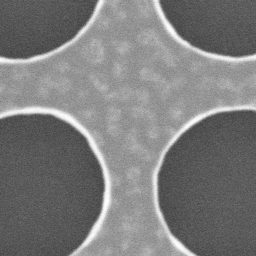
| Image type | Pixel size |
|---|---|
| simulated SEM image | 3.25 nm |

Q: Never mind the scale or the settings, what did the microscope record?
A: holes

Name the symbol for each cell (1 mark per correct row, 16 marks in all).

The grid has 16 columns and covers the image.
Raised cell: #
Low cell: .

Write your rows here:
......####......
.....######.....
....#######.....
..###########...
################
################
################
....########....
.....######.....
......####......
......####......
.......###......
.......###......
......####......
......#####.....
.....######.....